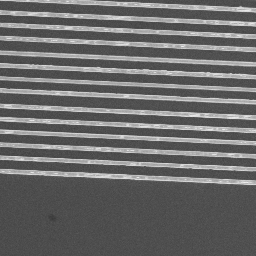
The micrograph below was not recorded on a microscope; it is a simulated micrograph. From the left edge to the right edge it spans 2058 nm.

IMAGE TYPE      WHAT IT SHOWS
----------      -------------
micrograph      parallel lines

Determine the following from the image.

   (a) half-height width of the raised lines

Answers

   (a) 0.0351 micrometres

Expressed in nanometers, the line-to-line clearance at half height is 70.3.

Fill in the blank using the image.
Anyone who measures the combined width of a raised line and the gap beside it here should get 106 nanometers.